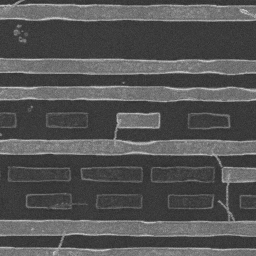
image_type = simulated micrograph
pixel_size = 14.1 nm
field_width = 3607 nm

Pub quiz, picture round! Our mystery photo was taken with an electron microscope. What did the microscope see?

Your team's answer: wiring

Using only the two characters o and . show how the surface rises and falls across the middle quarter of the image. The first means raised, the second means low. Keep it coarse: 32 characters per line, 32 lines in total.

oooooooooooooooooooooooooooooooo
oooooooooooooooooooooooooooooooo
......ooooooooooo...............
................................
................................
................................
oooooooooooooooooooooooooooooooo
oooooooooooooooooooooooooooooooo
oooooooooooooooooooooooooooooooo
................................
................................
................................
oooooo.................o........
oooooo.......ooooooooooo.......o
oooooo.......ooooooooooo.......o
oooooo.......ooooooooooo.......o
................................
................................
................................
ooooooooooooooo........ooooooooo
oooooooooooooooooooooooooooooooo
oooooooooooooooooooooooooooooooo
...ooooooooooooo.....ooooooooooo
................................
................................
................................
o...ooooooooooooooo...oooooooooo
o...ooooooooooooooo...oooooooooo
o....oooooooooooooo...oooooooooo
................................
................................
................................